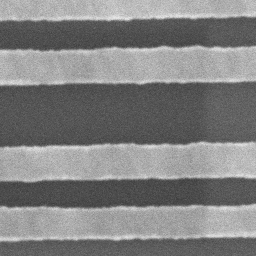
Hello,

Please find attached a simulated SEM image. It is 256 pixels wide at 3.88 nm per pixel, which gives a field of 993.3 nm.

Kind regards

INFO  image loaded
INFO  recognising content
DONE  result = lines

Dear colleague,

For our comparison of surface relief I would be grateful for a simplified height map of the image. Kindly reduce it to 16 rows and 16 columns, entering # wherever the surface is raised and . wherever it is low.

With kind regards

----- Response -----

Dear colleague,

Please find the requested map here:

################
................
................
################
################
................
................
................
................
################
################
................
................
################
################
................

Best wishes